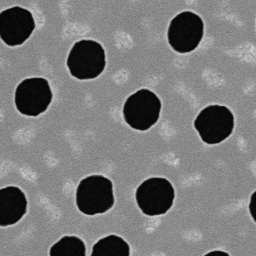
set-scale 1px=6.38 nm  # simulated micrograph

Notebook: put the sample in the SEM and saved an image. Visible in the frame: holes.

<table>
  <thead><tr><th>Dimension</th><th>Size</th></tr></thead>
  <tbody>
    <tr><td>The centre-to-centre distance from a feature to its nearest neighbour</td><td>413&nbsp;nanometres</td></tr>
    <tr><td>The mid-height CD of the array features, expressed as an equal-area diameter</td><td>244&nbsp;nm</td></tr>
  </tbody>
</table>